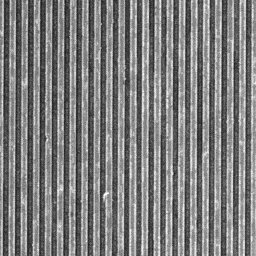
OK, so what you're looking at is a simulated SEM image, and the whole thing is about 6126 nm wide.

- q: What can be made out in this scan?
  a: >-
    parallel lines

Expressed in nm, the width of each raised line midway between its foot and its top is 126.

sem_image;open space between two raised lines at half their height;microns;0.165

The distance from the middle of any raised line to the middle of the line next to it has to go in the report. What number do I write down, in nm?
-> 290